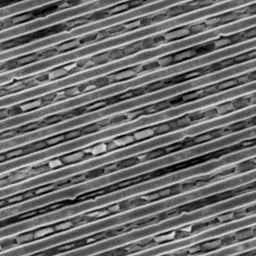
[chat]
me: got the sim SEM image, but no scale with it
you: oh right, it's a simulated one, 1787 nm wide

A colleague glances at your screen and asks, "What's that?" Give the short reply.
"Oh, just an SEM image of parallel lines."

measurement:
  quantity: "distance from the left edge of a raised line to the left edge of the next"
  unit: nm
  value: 148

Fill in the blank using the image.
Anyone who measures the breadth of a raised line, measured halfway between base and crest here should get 69.7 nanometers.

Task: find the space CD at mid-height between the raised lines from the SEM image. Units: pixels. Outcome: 10.9